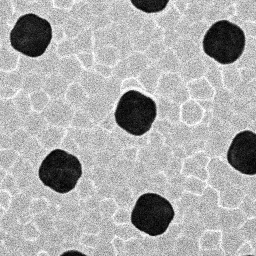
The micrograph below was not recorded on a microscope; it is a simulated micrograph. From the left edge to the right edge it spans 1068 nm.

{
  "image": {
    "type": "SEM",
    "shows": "holes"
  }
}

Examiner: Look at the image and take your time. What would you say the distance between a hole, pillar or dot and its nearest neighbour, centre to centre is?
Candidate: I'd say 424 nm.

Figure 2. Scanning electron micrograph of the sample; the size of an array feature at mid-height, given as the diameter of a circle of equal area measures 174 nm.